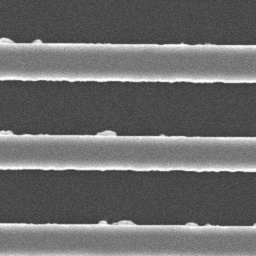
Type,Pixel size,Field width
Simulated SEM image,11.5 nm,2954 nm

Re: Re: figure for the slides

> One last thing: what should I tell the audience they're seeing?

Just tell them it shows lines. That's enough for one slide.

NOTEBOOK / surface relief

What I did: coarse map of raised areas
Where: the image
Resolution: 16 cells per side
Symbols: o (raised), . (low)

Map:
................
................
................
oooooooooooooooo
oooooooooooooooo
................
................
................
oooooooo........
oooooooooooooooo
oooooooooooooooo
................
................
................
oooooooooooooooo
oooooooooooooooo